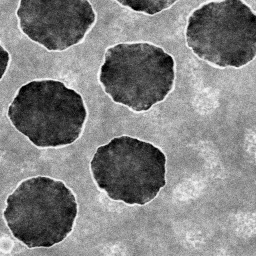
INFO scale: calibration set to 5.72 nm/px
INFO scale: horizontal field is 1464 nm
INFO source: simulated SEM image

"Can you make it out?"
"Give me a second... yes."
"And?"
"holes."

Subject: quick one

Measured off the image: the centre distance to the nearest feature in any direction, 552 nm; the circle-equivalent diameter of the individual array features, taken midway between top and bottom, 408 nm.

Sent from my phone